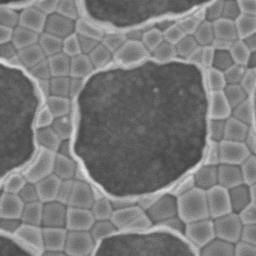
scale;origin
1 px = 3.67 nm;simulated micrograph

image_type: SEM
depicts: holes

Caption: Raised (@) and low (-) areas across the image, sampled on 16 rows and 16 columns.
@@@@@-------@@@@
@@@@@@@--@@@@@@@
@@@@@@@@@@@@@@@@
@@@@@@@@@@@@@@@@
-@@@@@-------@@@
--@@@--------@@@
--@@@--------@@@
--@@@--------@@@
--@@@--------@@@
--@@@--------@@@
-@@@@-------@@@@
@@@@@@-----@@@@@
@@@@@@@@@@@@@@@@
@@@@@@@@@@@@@@@@
@@@@@@@@@@@@@@@@
--@@@@------@@@@